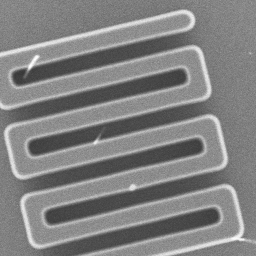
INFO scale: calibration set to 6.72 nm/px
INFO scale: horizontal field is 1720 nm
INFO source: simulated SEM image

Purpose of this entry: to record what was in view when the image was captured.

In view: groups of lines, slits or small figures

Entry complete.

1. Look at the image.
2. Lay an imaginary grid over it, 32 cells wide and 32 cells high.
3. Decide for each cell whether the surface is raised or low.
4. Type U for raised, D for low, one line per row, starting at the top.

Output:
DDDDDDDDDDDDDDDDDDDDDDDDDDDDDDDD
DDDDDDDDDDDDDDDDDDDDDDDDDDDDDDDD
DDDDDDDDDDDDDDDDDDUUUUUUDDDDDDDD
DDDDDDDDDDDDDDUUUUUUUUUUDDDDDDDD
DDDDDDDDDDUUUUUUUUUUDDDDDDDDDDDD
DDDDDDUUUUUUUUUUDDDDDDDDDDDDDDDD
DUUUUUUUUUUDDDDDDDDDUUUUUDDDDDDD
UUUUUUUUDDDDDDDDUUUUUUUUUDDDDDDD
UUUUDDDDDDDDUUUUUUUUUUUUUUDDDDDD
UUDDDDDDUUUUUUUUUUUDDDDUUUDDDDDD
UUDUUUUUUUUUUUDDDDDDDDDUUUDDDDDD
UUUUUUUUUUDDDDDDDDDUUUUUUUDDDDDD
UUUUUUDDDDDDDDUUUUUUUUUUUDDDDDDD
UUDDDDDDDDUUUUUUUUUUUDDDDDDDDDDD
DDDDDDUUUUUUUUUUUDDDDDDDDDDDDDDD
DDUUUUUUUUUUUDDDDDDDDDUUUUUDDDDD
DUUUUUUUDDDDDDDDDUUUUUUUUUUUDDDD
DUUUDDDDDDDDUUUUUUUUUUUUDUUUDDDD
DUUUDDDDUUUUUUUUUUUDDDDDDUUUDDDD
DUUUUUUUUUUUUUUDDDDDDDDDUUUUDDDD
DDUUUUUUUUUDDDDDDDDUUUUUUUUUDDDD
DDUUUUUDDDDDDDDUUUUUUUUUUUDDDDDD
DDDDDDDDDDDUUUUUUUUUUUDDDDDDDDDD
DDDDDDDUUUUUUUUUUUDDDDDDDDDUUDDD
DDDUUUUUUUUUUDDDDDDDDDUUUUUUUDDD
DDDUUUUUUDDDDDDDDDUUUUUUUUUUUUDD
DDDUUUDDDDDDDDUUUUUUUUUUDDDUUUDD
DDDUUUDDDDUUUUUUUUUUDDDDDDDUUUDD
DDDUUUUUUUUUUUUUDDDDDDDDDUUUUUDD
DDDDUUUUUUUDDDDDDDDDUUUUUUUUUUDD
DDDDUUUDDDDDDDDDUUUUUUUUUUUDDDDD
DDDDDDDDDDDDUUUUUUUUUUUDDDDDDDDD